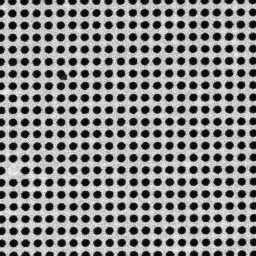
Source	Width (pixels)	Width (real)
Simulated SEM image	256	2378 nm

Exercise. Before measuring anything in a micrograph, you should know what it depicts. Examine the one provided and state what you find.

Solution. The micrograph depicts a regular array of holes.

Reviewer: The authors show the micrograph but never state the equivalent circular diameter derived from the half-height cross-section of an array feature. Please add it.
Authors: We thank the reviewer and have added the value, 73.3 nm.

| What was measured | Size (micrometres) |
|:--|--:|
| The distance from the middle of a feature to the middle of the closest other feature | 0.11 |